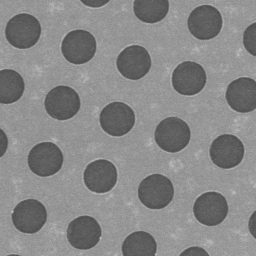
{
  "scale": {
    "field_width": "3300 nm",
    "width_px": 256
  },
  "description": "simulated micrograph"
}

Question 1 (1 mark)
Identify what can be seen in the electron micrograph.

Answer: a regular array of holes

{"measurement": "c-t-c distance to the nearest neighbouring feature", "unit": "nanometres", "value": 738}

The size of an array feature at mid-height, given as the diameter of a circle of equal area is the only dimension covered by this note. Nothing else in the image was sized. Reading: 0.46 micrometres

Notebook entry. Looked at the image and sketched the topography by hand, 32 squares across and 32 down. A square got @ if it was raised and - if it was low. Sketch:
@@@@@@@@@@---@@@@----@@@@@@@@@@@
@@@@@@@@@@@@@@@@@----@@@---@@@@@
@----@@@@@@@@@@@@@--@@@-----@@@@
@----@@@@@@@@@@@@@@@@@@-----@@@-
@----@@@----@@@@@@@@@@@@---@@@--
@---@@@@----@@@@@@@@@@@@@@@@@@--
@@@@@@@@----@@@----@@@@@@@@@@@@-
@@@@@@@@---@@@@----@@@@@@@@@@@@@
@@@@@@@@@@@@@@@----@@@---@@@@@@@
---@@@@@@@@@@@@---@@@-----@@@@@@
---@@@@@@@@@@@@@@@@@@@----@@@---
---@@@----@@@@@@@@@@@@---@@@----
--@@@@----@@@@@@@@@@@@@@@@@@----
@@@@@@----@@@---@@@@@@@@@@@@@---
@@@@@@---@@@-----@@@@@@@@@@@@@@@
@@@@@@@@@@@@@----@@@---@@@@@@@@@
-@@@@@@@@@@@@---@@@-----@@@@@@@@
-@@@@@@@@@@@@@@@@@@-----@@@---@@
-@@@---@@@@@@@@@@@@@---@@@-----@
@@@-----@@@@@@@@@@@@@@@@@@----@@
@@@-----@@@---@@@@@@@@@@@@@---@@
@@@@---@@@-----@@@@@@@@@@@@@@@@@
@@@@@@@@@@-----@@@---@@@@@@@@@@@
@@@@@@@@@@@---@@@-----@@@@@@@@@@
@@@@@@@@@@@@@@@@@-----@@@---@@@@
@@---@@@@@@@@@@@@@---@@@----@@@@
@@----@@@@@@@@@@@@@@@@@@----@@@@
@-----@@@---@@@@@@@@@@@@@---@@@-
@@---@@@-----@@@@@@@@@@@@@@@@@@-
@@@@@@@@-----@@@---@@@@@@@@@@@@@
@@@@@@@@@---@@@-----@@@@@@@@@@@@
@@@@@@@@@@@@@@@-----@@@---@@@@@@